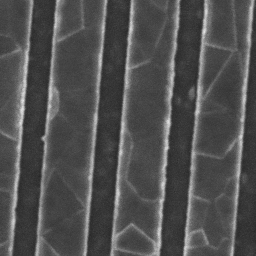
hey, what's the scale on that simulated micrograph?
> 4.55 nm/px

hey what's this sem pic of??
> one or a few lines or trenches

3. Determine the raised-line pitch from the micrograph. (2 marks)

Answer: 335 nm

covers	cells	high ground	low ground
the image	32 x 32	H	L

HHHHLLLHHHHHHLLLHHHHHHLLLLHHHHHH
HHHHLLLHHHHHHLLLHHHHHHLLLLHHHHHL
HHHHLLLHHHHHHLLLHHHHHHLLLLHHHHHL
HHHHLLLHHHHHHLLLHHHHHHLLLHHHHHHL
HHHHLLLHHHHHHLLLHHHHHHLLLHHHHHHL
HHHHLLLHHHHHHLLLHHHHHHLLLHHHHHHL
HHHLLLLHHHHHHLLLHHHHHHLLLHHHHHHL
HHHLLLLHHHHHHLLLHHHHHHLLLHHHHHHL
HHHLLLHHHHHHHLLLHHHHHHLLLHHHHHHL
HHHLLLHHHHHHLLLLHHHHHHLLLHHHHHHL
HHHLLLHHHHHHLLLLHHHHHHLLLHHHHHHL
HHHLLLHHHHHHLLLLHHHHHLLLLHHHHHHL
HHHLLLHHHHHHLLLLHHHHHLLLLHHHHHHL
HHHLLLHHHHHHLLLHHHHHHLLLLHHHHHLL
HHHLLLHHHHHHLLLHHHHHHLLLHHHHHHLL
HHHLLLHHHHHHLLLHHHHHHLLLHHHHHHLL
HHHLLLHHHHHHLLLHHHHHHLLLHHHHHHLL
HHHLLHHHHHHHLLLHHHHHHLLLHHHHHHLL
HHHLLLHHHHHHLLLHHHHHHLLLHHHHHHLL
HHLLLLHHHHHHLLLHHHHHHLLLHHHHHHLL
HHLLLHHHHHHHLLLHHHHHHLLLHHHHHHLL
HHLLLHHHHHHHLLLHHHHHHLLLHHHHHHLL
HHLLLHHHHHHLLLLHHHHHHLLLHHHHHHLL
HHLLLHHHHHHLLLLHHHHHLLLLHHHHHHLL
HHLLLHHHHHHLLLLHHHHHLLLLHHHHHHLL
HHLLLHHHHHHLLLHHHHHHLLLLHHHHHHLL
HHLLLHHHHHHLLLHHHHHHLLLLHHHHHLLL
HHLLLHHHHHHLLLHHHHHHLLLHHHHHHLLL
HHLLLHHHHHHLLLHHHHHHLLLHHHHHHLLL
HHLLLHHHHHHLLLHHHHHHLLLHHHHHHLLL
HHLLLHHHHHHLLLHHHHHHLLLHHHHHHLLL
HLLLLHHHHHHLLLHHHHHHLLLHHHHHHLLL